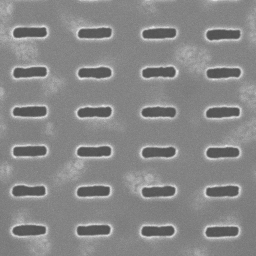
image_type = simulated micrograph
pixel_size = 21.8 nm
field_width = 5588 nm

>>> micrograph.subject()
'a regular array of holes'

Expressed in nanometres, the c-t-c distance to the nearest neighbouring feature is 858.